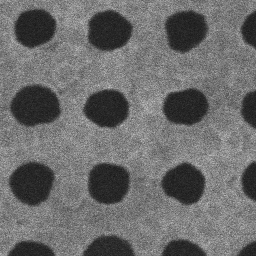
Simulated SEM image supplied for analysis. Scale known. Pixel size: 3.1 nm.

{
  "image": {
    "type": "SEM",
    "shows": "a regular array of holes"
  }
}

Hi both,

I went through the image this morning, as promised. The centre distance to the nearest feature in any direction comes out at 0.232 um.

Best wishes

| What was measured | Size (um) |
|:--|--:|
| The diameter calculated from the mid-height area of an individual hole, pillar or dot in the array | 0.128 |